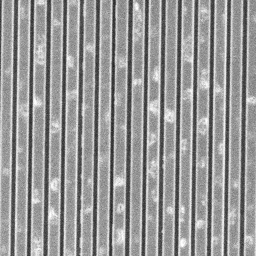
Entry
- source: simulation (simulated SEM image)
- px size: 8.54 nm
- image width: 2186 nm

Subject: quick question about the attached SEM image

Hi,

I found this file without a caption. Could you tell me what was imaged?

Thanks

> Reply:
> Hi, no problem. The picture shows parallel lines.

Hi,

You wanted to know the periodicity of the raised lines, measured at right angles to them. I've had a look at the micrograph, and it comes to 140 nanometres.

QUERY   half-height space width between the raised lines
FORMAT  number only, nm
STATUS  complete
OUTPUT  42.7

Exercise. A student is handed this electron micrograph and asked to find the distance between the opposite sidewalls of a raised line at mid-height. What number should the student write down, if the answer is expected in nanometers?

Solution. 102